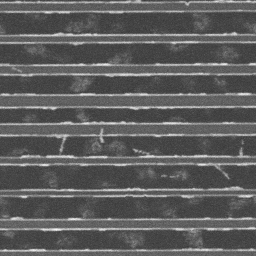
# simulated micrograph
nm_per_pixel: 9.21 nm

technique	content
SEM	parallel lines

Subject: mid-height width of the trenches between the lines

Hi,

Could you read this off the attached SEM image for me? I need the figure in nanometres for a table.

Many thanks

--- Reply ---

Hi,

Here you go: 79.4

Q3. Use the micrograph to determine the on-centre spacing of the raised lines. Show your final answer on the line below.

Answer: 285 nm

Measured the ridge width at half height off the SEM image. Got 213 nm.